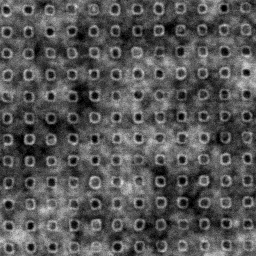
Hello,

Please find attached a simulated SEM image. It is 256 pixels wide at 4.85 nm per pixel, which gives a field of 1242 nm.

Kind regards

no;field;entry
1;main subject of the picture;a regular array of raised bodies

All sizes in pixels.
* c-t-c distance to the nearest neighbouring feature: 21.4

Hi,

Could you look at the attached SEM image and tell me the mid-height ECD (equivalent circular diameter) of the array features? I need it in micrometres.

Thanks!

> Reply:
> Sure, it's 0.0496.